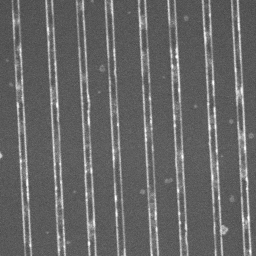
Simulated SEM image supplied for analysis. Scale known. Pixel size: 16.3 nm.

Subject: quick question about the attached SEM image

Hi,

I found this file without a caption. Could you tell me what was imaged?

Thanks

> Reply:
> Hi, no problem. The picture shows parallel lines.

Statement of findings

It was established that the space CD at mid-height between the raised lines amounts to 24.1 pixels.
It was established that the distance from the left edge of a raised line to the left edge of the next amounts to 511 nanometers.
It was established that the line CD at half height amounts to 110 nm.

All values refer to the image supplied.